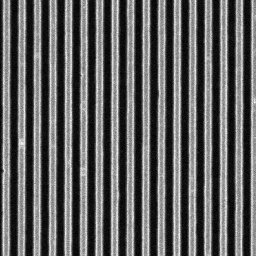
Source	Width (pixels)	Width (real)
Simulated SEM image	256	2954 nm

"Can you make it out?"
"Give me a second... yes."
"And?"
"parallel lines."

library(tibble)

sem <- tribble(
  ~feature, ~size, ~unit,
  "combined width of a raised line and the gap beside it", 179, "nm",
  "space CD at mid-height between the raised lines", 90.9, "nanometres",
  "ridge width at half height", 90.9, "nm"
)